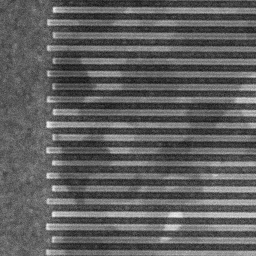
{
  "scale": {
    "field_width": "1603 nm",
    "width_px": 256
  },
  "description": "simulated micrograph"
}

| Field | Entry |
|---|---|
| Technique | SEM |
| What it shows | parallel lines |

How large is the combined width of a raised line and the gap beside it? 0.0799 um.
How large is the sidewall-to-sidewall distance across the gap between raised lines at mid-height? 46.9 nm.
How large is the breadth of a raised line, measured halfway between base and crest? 0.0313 µm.